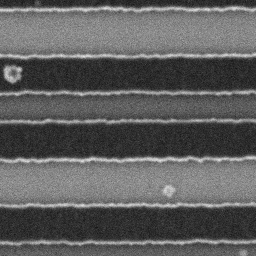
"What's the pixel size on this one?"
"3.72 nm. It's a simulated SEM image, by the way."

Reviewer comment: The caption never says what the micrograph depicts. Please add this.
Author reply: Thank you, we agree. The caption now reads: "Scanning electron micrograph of lines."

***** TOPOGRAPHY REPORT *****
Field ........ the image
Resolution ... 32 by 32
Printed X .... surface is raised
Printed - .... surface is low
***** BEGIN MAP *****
XXXXXXXXXXXXXXXXXXXXXXXXXXXXXXXX
--------------------------------
--------------------------------
--------------------------------
--------------------------------
--------------------------------
--------------------------------
XXXXXXXXXXXXXXXXXXXXXXXXXXXXXXXX
XXXXXXXXXXXXXXXXXXXXXXXXXXXXXXXX
XXXXXXXXXXXXXXXXXXXXXXXXXXXXXXXX
XXXXXXXXXXXXXXXXXXXXXXXXXXXXXXXX
XXXXXXXXXXXXXXXXXXXXXXXXXXXXXXXX
--------------------------------
--------------------------------
--------------------------------
XXXXXXXXXXXXXXXXXXXXXXXXXXXXXXXX
XXXXXXXXXXXXXXXXXXXXXXXXXXXXXXXX
XXXXXXXXXXXXXXXXXXXXXXXXXXXXXXXX
XXXXXXXXXXXXXXXXXXXXXXXXXXXXXXXX
XXXXXXXXXXXXXXXXXXXXXXXXXXXXXXXX
--------------------------------
--------------------------------
--------------------------------
--------------------------------
--------------------------------
----------------------X-----XX-X
XXXXXXXXXXXXXXXXXXXXXXXXXXXXXXXX
XXXXXXXXXXXXXXXXXXXXXXXXXXXXXXXX
XXXXXXXXXXXXXXXXXXXXXXXXXXXXXXXX
XXXXXXXXXXXXXXXXXXXXXXXXXXXXXXXX
-XX------X----------------------
--------------------------------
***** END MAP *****